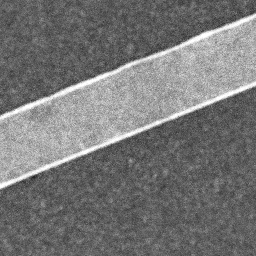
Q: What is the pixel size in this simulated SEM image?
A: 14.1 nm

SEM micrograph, one or a few lines or trenches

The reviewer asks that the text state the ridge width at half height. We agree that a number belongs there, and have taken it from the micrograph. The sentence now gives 0.894 um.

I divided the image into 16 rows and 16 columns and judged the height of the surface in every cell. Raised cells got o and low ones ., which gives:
................
...............o
............oooo
..........oooooo
.......ooooooooo
.....oooooooooo.
..ooooooooooo...
oooooooooo......
oooooooo........
ooooo...........
ooo.............
................
................
................
................
................